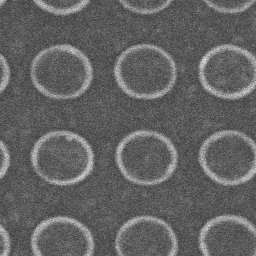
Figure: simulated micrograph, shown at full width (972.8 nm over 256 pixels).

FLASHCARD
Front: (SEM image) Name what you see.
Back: raised bodies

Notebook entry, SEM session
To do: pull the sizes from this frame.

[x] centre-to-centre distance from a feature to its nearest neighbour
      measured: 318 nm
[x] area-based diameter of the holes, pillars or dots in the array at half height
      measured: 212 nm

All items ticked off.